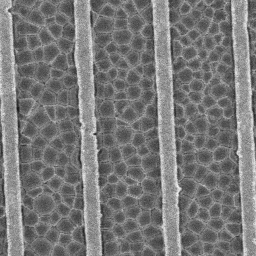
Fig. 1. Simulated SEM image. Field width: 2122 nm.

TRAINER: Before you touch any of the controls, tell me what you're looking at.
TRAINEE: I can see one or a few lines or trenches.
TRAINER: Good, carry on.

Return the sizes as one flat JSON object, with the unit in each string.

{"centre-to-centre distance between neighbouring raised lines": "650 nanometres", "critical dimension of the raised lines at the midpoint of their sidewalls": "120 nm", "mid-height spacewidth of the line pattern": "0.525 microns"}